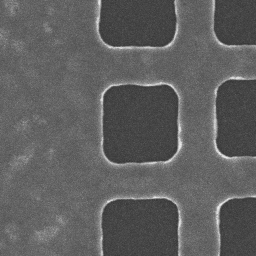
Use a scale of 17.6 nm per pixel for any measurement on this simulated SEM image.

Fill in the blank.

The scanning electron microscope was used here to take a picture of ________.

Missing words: holes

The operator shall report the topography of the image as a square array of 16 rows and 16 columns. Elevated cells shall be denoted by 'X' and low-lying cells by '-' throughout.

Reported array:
XXXXXX-----XX---
XXXXXX-----XX---
XXXXXX-----XXX--
XXXXXXXXXXXXXXXX
XXXXXXXXXXXXXXXX
XXXXXXX----XXX--
XXXXXX-----XXX--
XXXXXX-----XXX--
XXXXXX-----XX---
XXXXXXX----XXX--
XXXXXXXXXXXXXXXX
XXXXXXXXXXXXXXXX
XXXXXXX----XXX--
XXXXXX-----XXX--
XXXXXX-----XXX--
XXXXXX-----XXX--